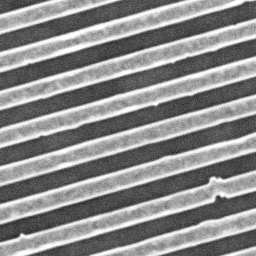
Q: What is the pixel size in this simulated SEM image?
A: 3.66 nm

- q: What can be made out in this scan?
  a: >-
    parallel lines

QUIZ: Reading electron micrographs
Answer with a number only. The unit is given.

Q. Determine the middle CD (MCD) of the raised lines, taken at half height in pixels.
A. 16.8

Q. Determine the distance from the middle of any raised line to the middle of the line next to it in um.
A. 0.134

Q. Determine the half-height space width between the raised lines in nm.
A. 71.3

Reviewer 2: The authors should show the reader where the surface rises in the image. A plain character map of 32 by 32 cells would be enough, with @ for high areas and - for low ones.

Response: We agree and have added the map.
-----@@@@@@@@---------@@@@@@@@--
--@@@@@@@----------@@@@@@@------
@@@@@@---------@@@@@@@@---------
@@---------@@@@@@@@---------@@@@
--------@@@@@@@@---------@@@@@@@
----@@@@@@@@---------@@@@@@@@---
-@@@@@@@---------@@@@@@@@@------
@@@@@---------@@@@@@@@---------@
@----------@@@@@@@@--------@@@@@
-------@@@@@@@@---------@@@@@@@@
----@@@@@@@---------@@@@@@@@----
@@@@@@@----------@@@@@@@@-------
@@@@---------@@@@@@@@---------@@
----------@@@@@@@---------@@@@@@
------@@@@@@@@---------@@@@@@@--
---@@@@@@@---------@@@@@@@@-----
@@@@@@@---------@@@@@@@---------
@@@---------@@@@@@@@----------@@
---------@@@@@@@----------@@@@@@
-----@@@@@@@@---------@@@@@@@---
--@@@@@@@---------@@@@@@@@------
@@@@@@---------@@@@@@@----------
@@@--------@@@@@@@@-------@@@@@@
--------@@@@@@@----------@@@@@@@
----@@@@@@@@---------@@@@@@-@---
-@@@@@@@@---------@@@@@@@-------
@@@@@---------@@@@@@@@---------@
@---------@@@@@@@@---------@@@@@
-------@@@@@@@@---------@@@@@@@@
---@@@@@@@@---------@@@@@@@@----
@@@@@@@@---------@@@@@@@@-------
@@@@---------@@@@@@@@---------@@